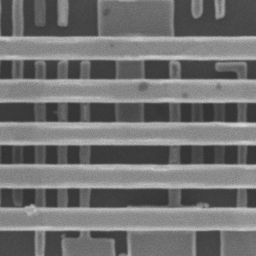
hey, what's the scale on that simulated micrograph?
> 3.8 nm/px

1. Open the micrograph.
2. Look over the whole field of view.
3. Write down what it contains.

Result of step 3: wiring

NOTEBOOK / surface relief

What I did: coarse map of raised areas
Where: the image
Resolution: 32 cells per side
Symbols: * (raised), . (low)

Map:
................................
................................
................................
................................
................................
********************************
********************************
................................
................................
................................
********************************
********************************
********************************
................................
................................
********************************
********************************
********************************
................................
................................
................................
********************************
********************************
................................
................................
................................
********************************
********************************
********************************
................................
................................
................................